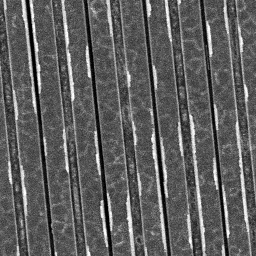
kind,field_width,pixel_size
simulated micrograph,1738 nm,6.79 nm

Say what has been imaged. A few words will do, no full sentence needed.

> parallel lines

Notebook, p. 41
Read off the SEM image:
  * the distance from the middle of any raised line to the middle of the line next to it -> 0.193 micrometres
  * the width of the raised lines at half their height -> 22.4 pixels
